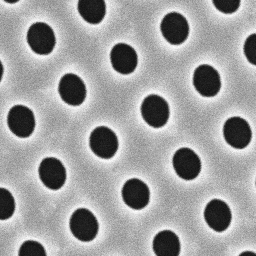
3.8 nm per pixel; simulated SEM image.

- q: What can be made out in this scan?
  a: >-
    a regular array of holes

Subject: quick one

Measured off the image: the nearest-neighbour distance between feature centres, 59.9 px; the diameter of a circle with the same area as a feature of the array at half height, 31.1 pixels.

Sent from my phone